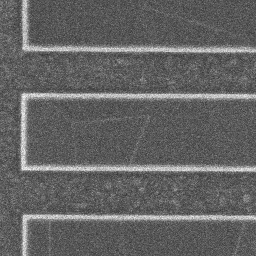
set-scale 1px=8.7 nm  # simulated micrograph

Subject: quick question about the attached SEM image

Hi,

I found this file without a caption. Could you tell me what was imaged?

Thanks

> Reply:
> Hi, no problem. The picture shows one or a few lines or trenches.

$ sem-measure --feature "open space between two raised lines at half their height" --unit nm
413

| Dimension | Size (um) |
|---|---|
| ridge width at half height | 0.632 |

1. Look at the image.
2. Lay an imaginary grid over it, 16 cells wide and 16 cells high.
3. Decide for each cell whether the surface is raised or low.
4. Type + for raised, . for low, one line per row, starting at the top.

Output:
..++++++++++++++
..++++++++++++++
..++++++++++++++
................
................
................
.+++++++++++++++
.+++++++++++++++
.+++++++++++++++
.+++++++++++++++
..++++++++++++++
................
................
................
..++++++++++++++
..++++++++++++++